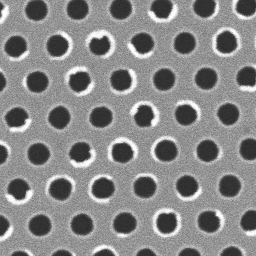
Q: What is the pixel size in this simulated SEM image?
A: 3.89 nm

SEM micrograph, a regular array of holes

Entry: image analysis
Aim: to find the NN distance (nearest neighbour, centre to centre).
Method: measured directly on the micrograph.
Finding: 41.2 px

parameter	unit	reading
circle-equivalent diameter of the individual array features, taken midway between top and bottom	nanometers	81.5